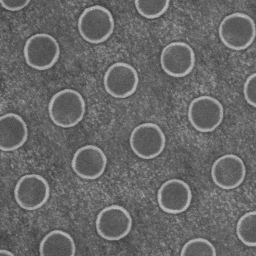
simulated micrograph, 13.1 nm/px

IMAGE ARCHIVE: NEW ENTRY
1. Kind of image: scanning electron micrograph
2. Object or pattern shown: a regular array of raised bodies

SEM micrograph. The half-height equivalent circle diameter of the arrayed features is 0.434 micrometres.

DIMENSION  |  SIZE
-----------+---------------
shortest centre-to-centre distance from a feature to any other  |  795 nanometers